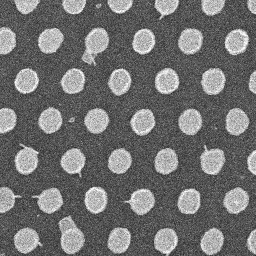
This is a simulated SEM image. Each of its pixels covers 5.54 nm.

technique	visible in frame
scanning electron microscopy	a regular array of raised bodies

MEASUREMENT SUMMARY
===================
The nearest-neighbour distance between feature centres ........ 254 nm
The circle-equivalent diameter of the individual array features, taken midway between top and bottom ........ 132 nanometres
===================